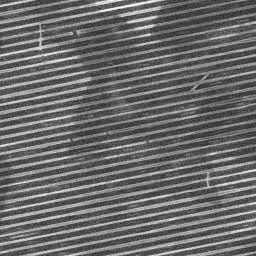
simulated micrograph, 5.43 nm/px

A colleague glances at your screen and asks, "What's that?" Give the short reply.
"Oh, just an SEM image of parallel lines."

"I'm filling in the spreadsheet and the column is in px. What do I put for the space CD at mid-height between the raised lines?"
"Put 6.02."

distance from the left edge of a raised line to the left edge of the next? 43.8 nanometers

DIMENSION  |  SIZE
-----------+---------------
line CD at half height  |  9.3 nm